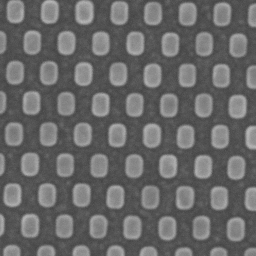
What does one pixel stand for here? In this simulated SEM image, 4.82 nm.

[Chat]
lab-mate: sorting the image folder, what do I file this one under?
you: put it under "a regular array of raised bodies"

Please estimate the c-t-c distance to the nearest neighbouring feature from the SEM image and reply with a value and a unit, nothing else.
0.164 um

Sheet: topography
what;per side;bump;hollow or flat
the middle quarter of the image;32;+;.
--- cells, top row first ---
...++++.....+++......+++.....+++
...++++.....++++....++++.....+++
...++++.....+++.....++++.....+++
...++++.....+++.....++++.....+++
...++++.....+++.....++++.....+++
..............................++
................................
++...............++.............
+++....++++.....++++....++++....
++.....++++.....++++....++++....
++.....++++.....++++....++++....
++.....++++.....++++....++++....
++.....++++.....+++.....++++....
................................
................................
...++++.....+++......++......+++
...++++....++++.....++++....++++
...++++....++++.....++++....++++
...++++....++++.....++++....++++
...+++.....++++.....++++....++++
............++......+++......+++
................................
................................
++.....++++.....+++.....++++....
++.....++++.....++++....++++....
++.....++++.....++++....++++....
++.....++++.....++++....++++....
++.....+++......+++.....++++....
................................
................................
...+++......++..................
...++++....++++.....+++.....++++